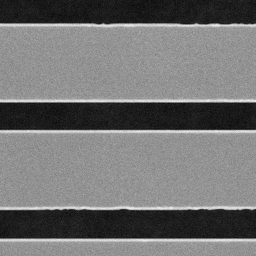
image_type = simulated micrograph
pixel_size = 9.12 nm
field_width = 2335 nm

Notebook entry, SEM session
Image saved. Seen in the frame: lines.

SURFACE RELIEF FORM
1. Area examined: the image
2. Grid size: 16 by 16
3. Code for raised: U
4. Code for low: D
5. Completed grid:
DDDDDDDDDDDDDDDD
DDDDDDDDDDDDDDDD
UUUUUUUUUUUUUUUU
UUUUUUUUUUUUUUUU
UUUUUUUUUUUUUUUU
UUUUUUUUUUUUUUUU
DDDDDDDDDDDDDDDD
DDDDDDDDDDDDDDDD
UUUUUUUUUUUUUUUU
UUUUUUUUUUUUUUUU
UUUUUUUUUUUUUUUU
UUUUUUUUUUUUUUUU
UUUUUUUUUUUUUUUU
DDDDDDDDDDDDDDDD
DDDDDDDDDDDDDDDD
UUUUUUUUUUUUUUUU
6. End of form